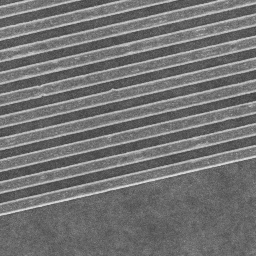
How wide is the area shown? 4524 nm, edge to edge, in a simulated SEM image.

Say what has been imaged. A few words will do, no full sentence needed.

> parallel lines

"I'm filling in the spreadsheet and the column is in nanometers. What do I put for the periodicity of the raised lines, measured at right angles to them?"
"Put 377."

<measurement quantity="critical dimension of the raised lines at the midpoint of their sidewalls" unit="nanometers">207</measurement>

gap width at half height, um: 0.174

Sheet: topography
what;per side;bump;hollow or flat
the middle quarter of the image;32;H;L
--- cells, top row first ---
HHHLLLLLLLLLLLLHHHHHHHHHHHHLLLLL
LLLLLLLLLLLHHHHHHHHHHHHLLLLLLLLL
LLLLLLHHHHHHHHHHHHHLLLLLLLLLLLHH
LLHHHHHHHHHHHHLLLLLLLLLLLLHHHHHH
HHHHHHHHHHLLLLLLLLLLLHHHHHHHHHHH
HHHHHHLLLLLLLLLLLHHHHHHHHHHHHHLL
HLLLLLLLLLLLHHHHHHHHHHHHHLLLLLLL
LLLLLLLLHHHHHHHHHHHHHLLLLLLLLLLL
LLLLHHHHHHHHHHHHHLLLLLLLLLLLHHHH
HHHHHHHHHHHHLLLLLLLLLLLLHHHHHHHH
HHHHHHHHLLLLLLLLLLLHHHHHHHHHHHHH
HHHHLLLLLLLLLLLHHHHHHHHHHHHHLLLL
LLLLLLLLLLLHHHHHHHHHHHHLLLLLLLLL
LLLLLLHHHHHHHHHHHHHLLLLLLLLLLLHH
LLHHHHHHHHHHHHHLLLLLLLLLLHHHHHHH
HHHHHHHHHHLLLLLLLLLLLHHHHHHHHHHH
HHHHHHLLLLLLLLLLHHHHHHHHHHHHHLLL
HLLLLLLLLLLLHHHHHHHHHHHHHLLLLLLL
LLLLLLLHHHHHHHHHHHHHLLLLLLLLLLLL
LLLHHHHHHHHHHHHHLLLLLLLLLLLHHHHH
HHHHHHHHHHHHLLLLLLLLLLLLHHHHHHHH
HHHHHHHLLLLLLLLLLLLHHHHHHHHHHHHL
HHHLLLLLLLLLLLHHHHHHHHHHHHHLLLLL
LLLLLLLLLLHHHHHHHHHHHHHLLLLLLLLL
LLLLLLHHHHHHHHHHHHLLLLLLLLLLLLHH
LHHHHHHHHHHHHHLLLLLLLLLLLHHHHHHH
HHHHHHHHHLLLLLLLLLLLLHHHHHHHHHHH
HHHHHLLLLLLLLLLLHHHHHHHHHHHHHLLL
HLLLLLLLLLLLHHHHHHHHHHHHHLLLLLLL
LLLLLLLLHHHHHHHHHHHHLLLLLLLLLLLL
LLLHHHHHHHHHHHHHLLLLLLLLLLLLLLLL
HHHHHHHHHHHHLLLLLLLLLLLLLLLLLLLL